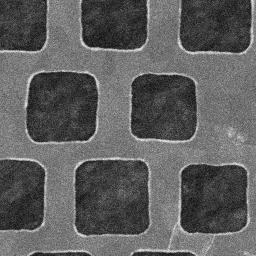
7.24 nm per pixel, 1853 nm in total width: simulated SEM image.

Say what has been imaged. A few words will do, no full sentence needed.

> holes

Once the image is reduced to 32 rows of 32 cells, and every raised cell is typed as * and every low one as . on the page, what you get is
......****.........****........*
......****.........***..........
......****........****..........
......****........****..........
......****........****..........
......****........****.........*
.**********************.......**
********************************
********************************
****.......******......*********
****........****........********
***.........****.........*******
***.........****.........*******
***.........****.........*******
***.........****.........*******
***.........****.........*******
***.........****........********
****.......********.....********
********************************
********************************
.....*****........******.****.**
......***..........****........*
......***..........***.........*
......***..........***.........*
......***..........***.........*
......***..........***.........*
......***..........***.........*
.....****..........***.........*
.....****.........****.........*
**********.***********.....*****
*********************.....******
*********..******.........******